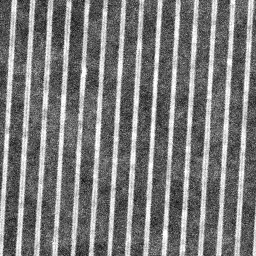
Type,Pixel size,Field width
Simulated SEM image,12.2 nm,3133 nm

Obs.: parallel lines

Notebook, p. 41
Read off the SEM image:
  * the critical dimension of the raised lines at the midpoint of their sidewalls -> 2.62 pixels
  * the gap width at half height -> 185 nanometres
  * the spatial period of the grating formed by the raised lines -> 222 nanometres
